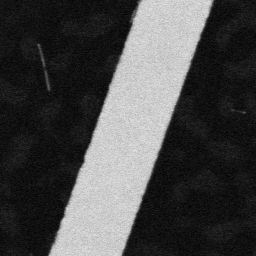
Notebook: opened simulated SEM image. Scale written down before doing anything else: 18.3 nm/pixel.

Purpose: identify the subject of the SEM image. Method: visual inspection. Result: one or a few lines or trenches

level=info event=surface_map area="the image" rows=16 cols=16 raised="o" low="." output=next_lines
ooooooooo....ooo
oooooooo.....ooo
oooooooo....oooo
oooooooo....oooo
ooooooo.....oooo
ooooooo....ooooo
ooooooo....ooooo
oooooo.....ooooo
oooooo....oooooo
ooooo.....oooooo
ooooo.....oooooo
ooooo....ooooooo
oooo.....ooooooo
oooo....oooooooo
oooo....oooooooo
ooo.....oooooooo